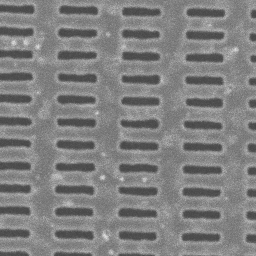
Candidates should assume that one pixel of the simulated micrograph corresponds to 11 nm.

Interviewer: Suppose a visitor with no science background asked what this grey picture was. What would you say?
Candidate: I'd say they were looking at a regular array of holes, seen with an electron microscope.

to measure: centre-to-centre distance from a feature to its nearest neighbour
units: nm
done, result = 243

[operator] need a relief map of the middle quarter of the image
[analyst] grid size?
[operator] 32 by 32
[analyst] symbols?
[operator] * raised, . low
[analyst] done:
********************************
********************************
...**...************************
........******..........******..
***.....*******.........******..
********************************
********************************
********************************
........******..........********
........******..........******..
******************......*******.
********************************
********************************
......**************************
........******..........******..
........******..........******..
********************************
********************************
********************************
........******........*********.
........******..........******..
***....*******....*....*******..
********************************
********************************
********************************
........******.........*******..
........******.........*******..
******************************..
********************************
********************************
.......*************************
........*****...........******..